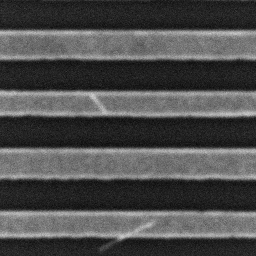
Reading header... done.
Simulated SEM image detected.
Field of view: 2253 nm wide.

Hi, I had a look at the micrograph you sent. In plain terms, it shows lines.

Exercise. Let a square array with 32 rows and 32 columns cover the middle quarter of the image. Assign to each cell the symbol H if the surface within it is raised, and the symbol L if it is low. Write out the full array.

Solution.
LLLLLLLLLLLLLLLLLLLLLLLLLLLLLLLL
LLLLLLLLLLLLLLLLLLLLLLLLLLLLLLLL
LLLLLLLLLLLLLLLLLLLLLLLLLLLLLLLL
LLLLLLLLLLLLLLLLLLLLLLLLLLLLLLLL
LLLLLLLLLLLLLLLLLLLLLLLLLLLLLLLL
LLLLLLLLLLLLLLLLLLLLLLLLLLLLLLLL
LLLLLLLLLLLLLLLLLLLLLLLLLLLLLLLL
HHHHHHHHHHHHHHHHHHHHHHHHHHHHHHHH
HHHHHHHHHHHHHHHHHHHHHHHHHHHHHHHH
HHHHHHHHHHHHHHHHHHHHHHHHHHHHHHHH
HHHHHHHHHHHHHHHHHHHHHHHHHHHHHHHH
HHHHHHHHHHHHHHHHHHHHHHHHHHHHHHHH
HHHHHHHHHHHHHHHHHHHHHHHHHHHHHHHH
LLLLLLLLLLLLLLLLLLLLLLLLLLLLLLLL
LLLLLLLLLLLLLLLLLLLLLLLLLLLLLLLL
LLLLLLLLLLLLLLLLLLLLLLLLLLLLLLLL
LLLLLLLLLLLLLLLLLLLLLLLLLLLLLLLL
LLLLLLLLLLLLLLLLLLLLLLLLLLLLLLLL
LLLLLLLLLLLLLLLLLLLLLLLLLLLLLLLL
LLLLLLLLLLLLLLLLLLLLLLLLLLLLLLLL
LLLLLLLLLLLLLLLLLLLLLLLLLLLLLLLL
HHHHHHHHHHHHHHHHHHHHHHHHHHHHHHHH
HHHHHHHHHHHHHHHHHHHHHHHHHHHHHHHH
HHHHHHHHHHHHHHHHHHHHHHHHHHHHHHHH
HHHHHHHHHHHHHHHHHHHHHHHHHHHHHHHH
HHHHHHHHHHHHHHHHHHHHHHHHHHHHHHHH
HHHHHHHHHHHHHHHHHHHHHHHHHHHHHHHH
HHHHHHHHHHHHHHHHHHHHHHHHHHHHHHHH
HLLLLLLLLLHHLLLLLLLLLLLLLLLLLLHH
LLLLLLLLLLLLLLLLLLLLLLLLLLLLLLLL
LLLLLLLLLLLLLLLLLLLLLLLLLLLLLLLL
LLLLLLLLLLLLLLLLLLLLLLLLLLLLLLLL